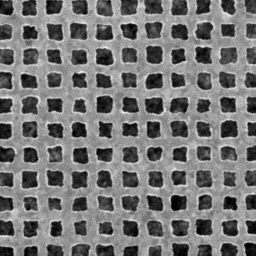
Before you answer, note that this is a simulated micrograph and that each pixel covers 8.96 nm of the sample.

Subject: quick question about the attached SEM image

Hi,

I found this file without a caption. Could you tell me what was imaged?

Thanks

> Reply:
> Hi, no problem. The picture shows a regular array of holes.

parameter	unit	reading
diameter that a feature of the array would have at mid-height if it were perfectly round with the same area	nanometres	156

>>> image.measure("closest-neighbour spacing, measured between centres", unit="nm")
214